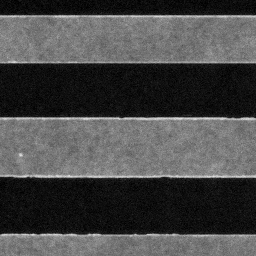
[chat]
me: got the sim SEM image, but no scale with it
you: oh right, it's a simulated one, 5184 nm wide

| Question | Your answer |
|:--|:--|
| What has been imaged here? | lines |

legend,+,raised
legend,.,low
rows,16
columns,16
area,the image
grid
................
++++++++++++++++
++++++++++++++++
++++++++++++++++
................
................
................
++++++++++++++++
++++++++++++++++
++++++++++++++++
++++++++++++++++
................
................
................
................
++++++++++++++++